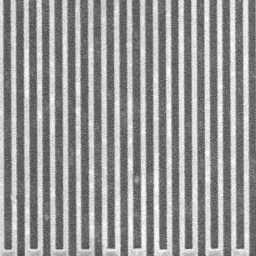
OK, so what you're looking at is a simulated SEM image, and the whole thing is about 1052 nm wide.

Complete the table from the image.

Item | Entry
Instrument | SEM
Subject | parallel lines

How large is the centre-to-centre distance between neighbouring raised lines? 52.9 nm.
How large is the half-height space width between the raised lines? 35.4 nm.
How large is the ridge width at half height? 18 nm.